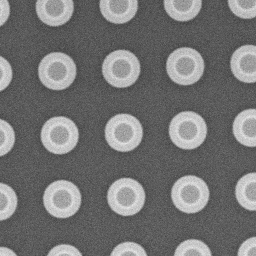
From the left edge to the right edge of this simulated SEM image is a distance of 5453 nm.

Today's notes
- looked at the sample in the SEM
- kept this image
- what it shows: an array of small figures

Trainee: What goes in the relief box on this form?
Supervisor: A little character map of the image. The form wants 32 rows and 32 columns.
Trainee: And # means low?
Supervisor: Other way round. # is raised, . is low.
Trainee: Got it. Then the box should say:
#....####....####....####....###
#....####....####....####....###
#....####.....##......##........
................................
................................
................................
..............##......###....###
#....####....####....####....###
#....####....####....####....###
#....####....####....####....###
#....####.....##......##........
................................
................................
................................
..............##......###.....##
#.....###....####....#####...###
##...#####...#####...#####...###
##...#####...#####...####.....##
#.....###.....###......#........
................................
................................
................................
...............##.....###.....##
#.....####....####....####...###
##...#####...#####...#####....##
##....####....####....####....##
##....###.....###......##.......
................................
................................
................................
...............##......###....##
##....####....####....####....##